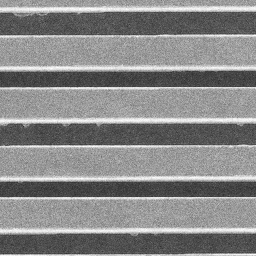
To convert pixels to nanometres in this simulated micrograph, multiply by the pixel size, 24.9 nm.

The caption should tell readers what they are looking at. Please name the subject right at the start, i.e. lines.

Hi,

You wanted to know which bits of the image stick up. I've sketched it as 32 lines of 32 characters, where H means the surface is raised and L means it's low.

HHHHHHHHHHHHHHHHHHHHHHHHHHHHHHHH
LLLLLLLLLLLLLLLLLLLLLLLLLLLLLLLL
LLLLLLLLLLLLLLLLLLLLLLLLLLLLLLLL
LLLLLLLLLLLLLLLLLLLLLLLLLLLLLLLL
LLLLLLLLLLLLLLLLLLLLHHHHHHHHHHHH
HHHHHHHHHHHHHHHHHHHHHHHHHHHHHHHH
HHHHHHHHHHHHHHHHHHHHHHHHHHHHHHHH
HHHHHHHHHHHHHHHHHHHHHHHHHHHHHHHH
HHHHHHHHHHHHHHHHHHHHHHHHHHHHHHHH
LLLLLLLLLLLLLLLLLLLLLLLLLLLLLLLL
LLLLLLLLLLLLLLLLLLLLLLLLLLLLLLLL
HHHHHHHHHHHHHHHHHHHHHHHHHHHHHHHH
HHHHHHHHHHHHHHHHHHHHHHHHHHHHHHHH
HHHHHHHHHHHHHHHHHHHHHHHHHHHHHHHH
HHHHHHHHHHHHHHHHHHHHHHHHHHHHHHHH
LLLLLLLLLLLLLLLLLLLLLLLLLLLLLLLL
LLLLLLLLLLLLLLLLLLLLLLLLLLLLLLLL
LLLLLLLLLLLLLLLLLLLLLLLLLLLLLLLL
HHHHHHHHHHHHHHHHHHHHHHHHHHHHHHHH
HHHHHHHHHHHHHHHHHHHHHHHHHHHHHHHH
HHHHHHHHHHHHHHHHHHHHHHHHHHHHHHHH
HHHHHHHHHHHHHHHHHHHHHHHHHHHHHHHH
HHHHHHHHHHHHHHHHHHHHHHHHHHHHHHHH
LLLLLLLLLLLLLLLLLLLLLLLLLLLLLLLL
LLLLLLLLLLLLLLLLLLLLLLLLLLLLLLLL
HHHHHHHHHHHHHHHHHHHHHHHHHHHHHHHH
HHHHHHHHHHHHHHHHHHHHHHHHHHHHHHHH
HHHHHHHHHHHHHHHHHHHHHHHHHHHHHHHH
HHHHHHHHHHHHHHHHHHHHHHHHHHHHHHHH
LLLLLLLLLLLLLLLLLLLLLLLLLLLLLLLL
LLLLLLLLLLLLLLLLLLLLLLLLLLLLLLLL
LLLLLLLLLLLLLLLLLLLLLLLLLLLLLLLL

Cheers